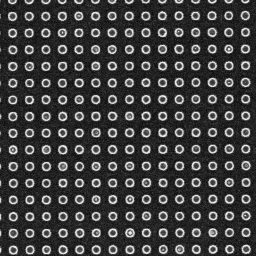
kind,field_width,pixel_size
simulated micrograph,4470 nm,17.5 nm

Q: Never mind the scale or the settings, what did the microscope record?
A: a regular array of raised bodies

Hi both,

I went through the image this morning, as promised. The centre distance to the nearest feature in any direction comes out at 287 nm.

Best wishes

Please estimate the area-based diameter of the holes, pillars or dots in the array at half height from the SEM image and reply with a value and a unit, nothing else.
139 nm